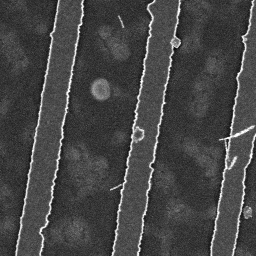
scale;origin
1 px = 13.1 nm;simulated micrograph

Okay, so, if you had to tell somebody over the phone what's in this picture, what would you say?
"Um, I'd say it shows one or a few lines or trenches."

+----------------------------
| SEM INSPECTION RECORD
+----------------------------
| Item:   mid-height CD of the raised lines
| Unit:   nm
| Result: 332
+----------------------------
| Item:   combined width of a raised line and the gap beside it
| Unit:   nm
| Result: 1250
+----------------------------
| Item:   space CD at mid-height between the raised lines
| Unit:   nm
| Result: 916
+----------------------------